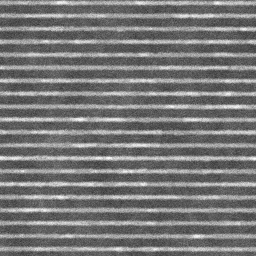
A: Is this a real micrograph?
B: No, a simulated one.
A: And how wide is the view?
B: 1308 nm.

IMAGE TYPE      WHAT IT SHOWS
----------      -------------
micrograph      parallel lines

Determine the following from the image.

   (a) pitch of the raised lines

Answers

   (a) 66.2 nm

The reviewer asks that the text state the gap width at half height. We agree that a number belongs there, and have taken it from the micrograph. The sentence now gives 50.5 nm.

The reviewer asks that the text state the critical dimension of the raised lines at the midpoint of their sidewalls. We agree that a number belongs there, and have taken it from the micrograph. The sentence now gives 12.8 nanometers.